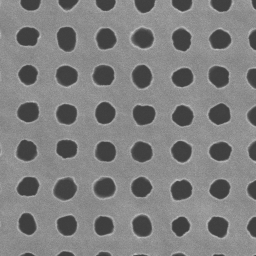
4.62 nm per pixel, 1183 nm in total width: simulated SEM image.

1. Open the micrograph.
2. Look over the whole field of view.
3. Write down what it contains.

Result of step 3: a regular array of holes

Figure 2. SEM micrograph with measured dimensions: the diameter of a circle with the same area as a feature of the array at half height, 0.0936 microns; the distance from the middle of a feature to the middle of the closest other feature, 170 nm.